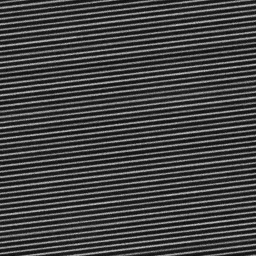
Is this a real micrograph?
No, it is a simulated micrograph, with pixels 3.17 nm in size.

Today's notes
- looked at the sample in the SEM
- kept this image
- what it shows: parallel lines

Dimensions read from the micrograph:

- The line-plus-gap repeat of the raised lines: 17.2 nanometres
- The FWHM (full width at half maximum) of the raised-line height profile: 5.5 nm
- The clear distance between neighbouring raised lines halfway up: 10.6 nanometers